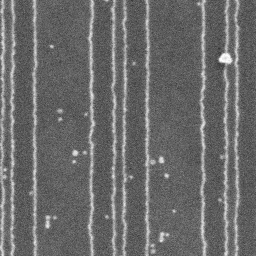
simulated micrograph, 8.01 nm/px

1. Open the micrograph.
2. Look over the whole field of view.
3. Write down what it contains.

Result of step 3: lines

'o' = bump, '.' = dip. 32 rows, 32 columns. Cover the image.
oo..oooooooo..oo..ooooooo...oo..
oo..oooooooo..oo..ooooooo...oo..
oo..oooooooo..oo..ooooooo...oo..
oo..ooooooo...oo..ooooooo...oo..
oo..ooooooo...oo..ooooooo...oo..
oo..ooooooo...oo..ooooooo...oo..
oo..ooooooo...oo..ooooooo...oo..
oo..ooooooo...oo..ooooooo...oo..
oo..ooooooo...oo..oooooooo..oo..
oo..ooooooo...oo..oooooooo..oo..
oo..ooooooo...oo..oooooooo..oo..
oo..oooooooo..oo..ooooooo...oo..
oo..ooooooo...oo..ooooooo...oo..
oo..ooooooo...oo..ooooooo...oo..
oo..ooooooo...oo..ooooooo...oo..
oo..oooooooo..oo..ooooooo...oo..
oo..ooooooo...oo..ooooooo...oo..
oo..ooooooo...oo..ooooooo...oo..
oo..oooooooo..o...oooooooo..oo..
oo..ooooooo...o...ooooooo...oo..
oo..ooooooo...oo..ooooooo...oo..
oo..ooooooo...oo..ooooooo...oo..
oo..ooooooo...oo..oooooooo..oo..
oo..ooooooo...o...ooooooo...oo..
oo..ooooooo...oo..ooooooo...oo..
oo..oooooooo..oo..ooooooo...oo..
oo..oooooooo..oo..ooooooo...oo..
oo..ooooooo...o...ooooooo...oo..
oo..ooooooo...oo..ooooooo...oo..
oo..ooooooo...oo..ooooooo...oo..
oo..ooooooo...oo..oooooooo..oo..
oo..oooooooo..oo..oooooooo..oo..